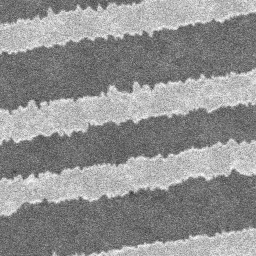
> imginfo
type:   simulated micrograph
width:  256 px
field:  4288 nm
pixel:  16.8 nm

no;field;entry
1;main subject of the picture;one or a few lines or trenches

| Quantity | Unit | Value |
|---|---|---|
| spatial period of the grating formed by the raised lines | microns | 1.24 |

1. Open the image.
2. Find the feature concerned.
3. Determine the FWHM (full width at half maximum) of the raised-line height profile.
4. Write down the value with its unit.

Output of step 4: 488 nm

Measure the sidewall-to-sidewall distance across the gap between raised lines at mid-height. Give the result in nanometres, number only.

907